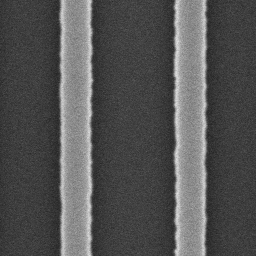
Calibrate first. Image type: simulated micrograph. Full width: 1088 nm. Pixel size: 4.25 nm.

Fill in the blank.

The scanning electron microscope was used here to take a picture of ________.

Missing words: lines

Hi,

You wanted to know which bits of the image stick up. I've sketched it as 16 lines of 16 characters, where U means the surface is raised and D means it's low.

DDDDUUDDDDDUUDDD
DDDDUUDDDDDUUDDD
DDDDUUDDDDDUUDDD
DDDDUUDDDDDUUDDD
DDDDUUDDDDDUUDDD
DDDDUUDDDDDUUDDD
DDDDUUDDDDDUUDDD
DDDDUUDDDDDUUDDD
DDDDUUDDDDDUUDDD
DDDDUUDDDDDUUDDD
DDDDUUDDDDDUUDDD
DDDDUUDDDDDUUDDD
DDDDUUDDDDDUUDDD
DDDDUUDDDDDUUDDD
DDDDUUDDDDDUUDDD
DDDDUUDDDDDUUDDD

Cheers